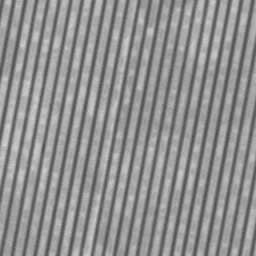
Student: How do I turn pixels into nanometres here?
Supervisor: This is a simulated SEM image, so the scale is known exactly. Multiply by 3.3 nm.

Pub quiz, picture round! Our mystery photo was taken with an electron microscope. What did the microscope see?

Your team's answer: parallel lines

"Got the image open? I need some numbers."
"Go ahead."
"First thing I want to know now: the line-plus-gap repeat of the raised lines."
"36.9 nanometres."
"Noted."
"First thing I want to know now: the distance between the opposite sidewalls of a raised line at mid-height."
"0.0219 microns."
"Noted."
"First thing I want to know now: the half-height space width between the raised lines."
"4.67 px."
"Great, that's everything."